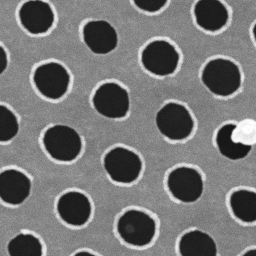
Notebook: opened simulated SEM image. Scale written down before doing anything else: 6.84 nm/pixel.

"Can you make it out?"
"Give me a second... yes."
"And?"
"a regular array of holes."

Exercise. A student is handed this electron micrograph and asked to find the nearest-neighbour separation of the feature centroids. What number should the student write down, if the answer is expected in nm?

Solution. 434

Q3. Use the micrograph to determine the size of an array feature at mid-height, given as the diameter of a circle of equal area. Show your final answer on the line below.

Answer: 246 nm